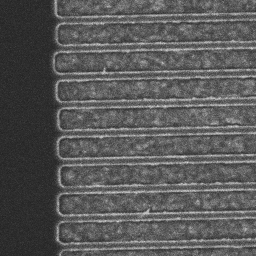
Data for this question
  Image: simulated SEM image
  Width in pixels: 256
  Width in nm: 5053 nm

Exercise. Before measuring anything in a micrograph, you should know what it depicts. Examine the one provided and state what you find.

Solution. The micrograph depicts parallel lines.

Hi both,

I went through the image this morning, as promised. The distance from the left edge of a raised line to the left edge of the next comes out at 558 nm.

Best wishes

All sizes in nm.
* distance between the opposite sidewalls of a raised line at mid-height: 155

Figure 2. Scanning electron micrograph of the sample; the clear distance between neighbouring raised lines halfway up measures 410 nm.